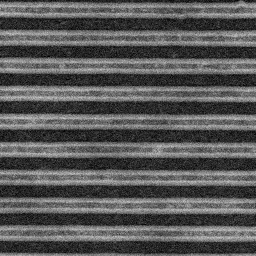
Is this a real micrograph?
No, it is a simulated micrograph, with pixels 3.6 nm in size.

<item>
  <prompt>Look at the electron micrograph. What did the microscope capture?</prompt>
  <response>parallel lines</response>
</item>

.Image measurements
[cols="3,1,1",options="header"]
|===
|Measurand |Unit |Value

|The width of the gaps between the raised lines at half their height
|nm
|57.2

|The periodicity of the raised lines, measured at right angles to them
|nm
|100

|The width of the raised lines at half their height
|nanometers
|41.4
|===